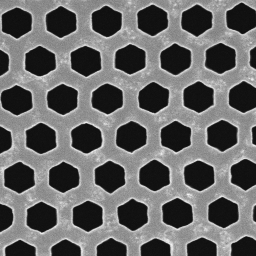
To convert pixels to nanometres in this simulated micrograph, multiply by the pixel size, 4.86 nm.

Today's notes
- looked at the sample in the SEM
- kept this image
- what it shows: a regular array of holes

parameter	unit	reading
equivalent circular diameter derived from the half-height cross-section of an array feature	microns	0.146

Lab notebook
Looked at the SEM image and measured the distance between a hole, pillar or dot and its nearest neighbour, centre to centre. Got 0.216 µm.